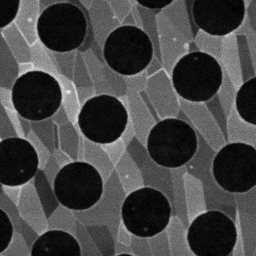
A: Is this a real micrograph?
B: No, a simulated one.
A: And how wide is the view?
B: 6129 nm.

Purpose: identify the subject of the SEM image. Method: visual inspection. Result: a regular array of holes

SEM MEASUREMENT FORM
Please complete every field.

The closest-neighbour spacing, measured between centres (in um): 1.7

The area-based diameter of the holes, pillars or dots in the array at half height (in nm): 1210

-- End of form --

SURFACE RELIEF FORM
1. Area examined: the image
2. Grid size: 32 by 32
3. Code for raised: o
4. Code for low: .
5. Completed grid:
.....oo..oooooooo....ooo.......o
..........oooooooooo.ooo.......o
...........ooooooooooooo......oo
oo.........oooo..oooooooo.....oo
ooo........oo......oooooooo.oooo
ooooo.....ooo......ooooooooooooo
ooooooo...ooo......ooo...ooooooo
ooooooooo..oo.......o......ooooo
oo..ooooo..ooo..............oooo
oo.....oo.ooooooooooo.......oooo
oo.....oo...oooooooooo......oo..
o.......oo..oooooooooo.....ooo..
o.......oo.....oooooooo...ooo...
oo.....ooo......oooooooooooooo..
ooo...oooo......oooooooooooooo..
oooooooooo......ooo.....ooooooo.
oooooooooo.....oooo.....oooooooo
...oooooooo....ooo.......ooooooo
....oooooooooooooo.......ooo....
.....oooooooooooooo.....ooo.....
.....ooo...ooooooooo...oooo.....
.....oo.....ooooooooooooooo.....
....ooo......oooooooooooooo.....
ooo.ooo......ooooo.ooooooooo....
oo...oo......ooo.....ooooooooooo
oo...oo.....ooo......ooooooooooo
.o...oooooooooo......ooooo..oooo
.oo...ooooooooo.......oo.....ooo
..oo..oooooooooo.......o......oo
..ooo....oooooooo..ooo........oo
.ooo......ooooooooooooo......ooo
oooo......ooooooooooooo......ooo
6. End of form